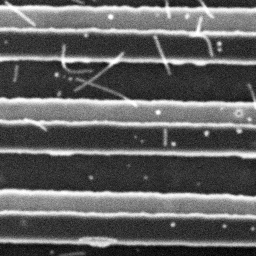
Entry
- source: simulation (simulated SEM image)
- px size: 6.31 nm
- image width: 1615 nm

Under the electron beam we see lines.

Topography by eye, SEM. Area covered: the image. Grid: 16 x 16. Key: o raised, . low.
oooooooo.oo.....
oooooooooooooooo
oooooooooooooooo
oooooooooooooooo
................
................
oooooooooooooooo
oooooooooooooooo
oooooooooooooooo
.ooooooooooooooo
................
................
oooooooooooooooo
oooooooooooooooo
oooooooooooooooo
................